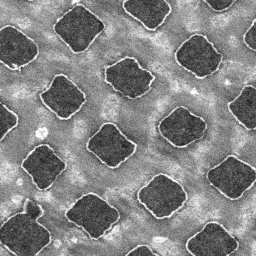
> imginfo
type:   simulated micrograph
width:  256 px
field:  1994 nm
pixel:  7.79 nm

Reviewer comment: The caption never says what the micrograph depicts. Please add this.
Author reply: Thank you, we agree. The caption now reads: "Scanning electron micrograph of a regular array of raised bodies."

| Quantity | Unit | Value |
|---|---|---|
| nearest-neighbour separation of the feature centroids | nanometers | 541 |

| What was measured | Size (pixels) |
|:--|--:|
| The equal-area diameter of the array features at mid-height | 41.6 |